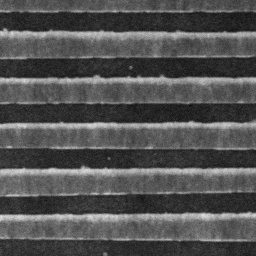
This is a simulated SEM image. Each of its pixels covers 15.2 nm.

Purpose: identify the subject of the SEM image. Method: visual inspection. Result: lines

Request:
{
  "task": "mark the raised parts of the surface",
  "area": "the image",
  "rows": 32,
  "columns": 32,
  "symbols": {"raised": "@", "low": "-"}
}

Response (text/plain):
@@@@@@@@@@@@@@@@@@@@@@@@@@@@@@@@
--------------------------------
--------------------------------
--------------------------------
@@@@@@@@@@@@@@@@@@@@@@@@@@@@@@@@
@@@@@@@@@@@@@@@@@@@@@@@@@@@@@@@@
@@@@@@@@@@@@@@@@@@@@@@@@@@@@@@@@
--------------------------------
--------------------------------
--------------------------------
@@@@@@@@@@@@@@@@@@@@@@@@@@@@@@@@
@@@@@@@@@@@@@@@@@@@@@@@@@@@@@@@@
@@@@@@@@@@@@@@@@@@@@@@@@@@@@@@@@
--------------------------------
--------------------------------
------------@--------@@@@--@@---
@@@@@@@@@@@@@@@@@@@@@@@@@@@@@@@@
@@@@@@@@@@@@@@@@@@@@@@@@@@@@@@@@
-------@@@-@@-@@@@@@@@@@@@@@@@@@
--------------------------------
--------------------------------
@@@@@@@@@@@@@@@@@@@@@@@@@@@@@@@@
@@@@@@@@@@@@@@@@@@@@@@@@@@@@@@@@
@@@@@@@@@@@@@@@@@@@@@@@@@@@@@@@@
--------------------------------
--------------------------------
--------------------------------
@@@@@@@@@@@@@@@@@@@@@@@@@@@@@@@@
@@@@@@@@@@@@@@@@@@@@@@@@@@@@@@@@
@@@@@@@@@@@@@@@@@@@@@@@@@@@@@@@@
--------------------------------
--------------------------------